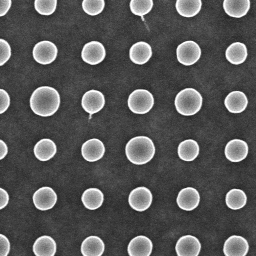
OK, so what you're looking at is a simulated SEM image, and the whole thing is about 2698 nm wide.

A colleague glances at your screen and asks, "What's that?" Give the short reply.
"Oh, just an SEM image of a regular array of raised bodies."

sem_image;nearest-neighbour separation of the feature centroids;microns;0.502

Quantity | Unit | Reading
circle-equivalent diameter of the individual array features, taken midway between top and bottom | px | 22.6